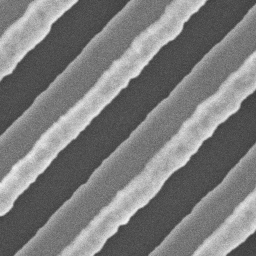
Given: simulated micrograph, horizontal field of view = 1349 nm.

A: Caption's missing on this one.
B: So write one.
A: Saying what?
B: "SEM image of lines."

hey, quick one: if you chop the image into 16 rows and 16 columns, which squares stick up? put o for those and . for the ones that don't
oooo....oooo....
ooo....ooooo...o
ooo...ooooo...oo
oo...ooooo...ooo
o...ooooo...oooo
...ooooo...ooooo
..ooooo...ooooo.
.ooooo...ooooo..
ooooo...ooooo...
oooo...ooooo....
ooo...ooooo....o
oo...ooooo....oo
o...ooooo....ooo
...ooooo....oooo
..ooooo....ooooo
.ooooo....ooooo.